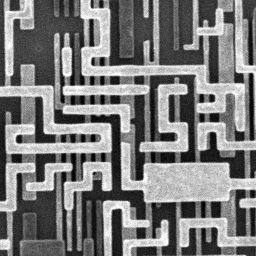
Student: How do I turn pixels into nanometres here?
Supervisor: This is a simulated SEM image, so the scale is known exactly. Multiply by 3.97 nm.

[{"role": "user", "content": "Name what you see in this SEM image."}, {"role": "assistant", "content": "wiring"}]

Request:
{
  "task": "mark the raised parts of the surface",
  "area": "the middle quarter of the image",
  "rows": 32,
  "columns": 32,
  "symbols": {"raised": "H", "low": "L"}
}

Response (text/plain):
HHLLHHHLLLLLLLLHHHLLLLLLLLLLHHHH
HHLLHHHHHHHHHHHHHHHHHHHHHHHHHHHH
HHLLLHHHHHHHHHHHHHHHHHHHHLLLLLLL
LLLLLLLLLLLLLLLLLLLLLLLLLLLLLLLL
LLLLLLLLLLLLLLLLLLLLLLLLLLLLLLLL
LLLLHHHHHHHHHHHHHHHHHLLLHHHHHHHL
HHHHHHHHHHHHHHHHHHHHHLLLHHHHHHHL
HHHHHHHHHHHHHHHHHHHHLLLLHHHHHHLL
LLLLLLLLLLLLLLLLLLLLLLLLHHLLLLLL
LLLLLLLLLLLLLLLLLLLLLLLLHHLLLLLL
LLLLLHHHHHHHHHHHLLLLLLLLHHLLLLLL
HHHHHHHHHHHHHHHHLLLLLLLLHHLLLLLL
LLLHHHHHHHLLLHHHLLLLLLLLHHLLLLLL
LLLLLLLLLLLLLLHHLLLLLLLLHHLLLLLL
LLLLLLLLLLLLLLHHLLLLLLLLHHLLLLLL
HHHHHHHHHHHHLLHHLLLLLLLLHHHHHHHL
HHHHHHHHHHHHLLHHLLLLLLLLHHHHHHHL
LLLLLLLLLHHHLLLLLLLLLLLLLLLLHHHL
LLLLLLLLLHHHLLLLLLLLLLLLLLLLLHHL
LLLLLLLLLHHHLLLLLLLLLLLLHHHHHHHL
HHHHHHHHHHHHLLHHLLLHHHHHHHHHHHHL
HHHHHHHHHHHHLLHHLLLHHHHHHHHHHHHL
LLLLLLLLLLLLLLLHLLLLLLLLLLLLLLLL
LLLLLLLLLLLLLLLHLLLLLLLLLLLLLLLL
LLLLLLLLLLLLLLLHLLLLLLLLLLLLLLLL
HHLLLHHHHHHHLLLHLLLLHHHHHHHHHHHH
HHLLLHHHHHHHLLLHLLLLHHHHHHHHHHHH
LLLLLHHLLLHHLLLHLLLLHHHHHHHHHHHH
LLLLLHHLLLHHLLLHHLLLHHHHHHHHHHHH
LLLLHHHLLLHHLLLHHHHHHHHHHHHHHHHH
HHHHHHHLLLHHLLLHHHHHHHHHHHHHHHHH
HHHHHHHLLLHHLLLLLLLHHHHHHHHHHHHH